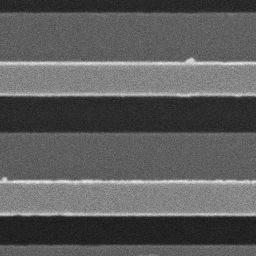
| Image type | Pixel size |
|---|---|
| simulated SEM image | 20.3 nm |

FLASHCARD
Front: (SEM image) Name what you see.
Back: lines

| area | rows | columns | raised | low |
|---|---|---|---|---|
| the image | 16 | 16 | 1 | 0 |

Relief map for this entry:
0000000000000000
1111111111111111
1111111111111111
1111111111111111
1111111111111111
1111111111111111
0000000000000000
0000000000000000
1111111111111111
1111111111111111
1111111111111111
1111111111111111
1111111111111111
0000000000000000
0000000000000000
1111111111111111